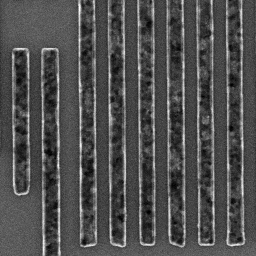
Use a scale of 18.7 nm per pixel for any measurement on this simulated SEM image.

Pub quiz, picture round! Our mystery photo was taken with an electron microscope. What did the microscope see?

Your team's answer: wiring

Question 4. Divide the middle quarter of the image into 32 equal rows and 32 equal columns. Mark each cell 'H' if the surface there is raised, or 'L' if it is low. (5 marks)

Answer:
LLLLHHHHLLLHHHHLLLLHHHLLLLHHHHLL
LLLLHHHHLLLHHHHLLLLHHHLLLLHHHHLL
LLLLHHHHLLLHHHHLLLLHHHLLLLHHHHLL
LLLLHHHHLLLHHHHLLLLHHHLLLLHHHHLL
LLLLHHHHLLLHHHHLLLLHHHLLLLHHHHLL
LLLLHHHHLLLHHHHLLLLHHHLLLLHHHHLL
LLLLHHHHLLLHHHHLLLLHHHLLLLHHHHLL
LLLLHHHHLLLHHHHLLLLHHHLLLLHHHHLL
LLLLHHHHLLLHHHHLLLLHHHLLLLHHHHLL
LLLLHHHHLLLHHHHLLLLHHHLLLLHHHHLL
LLLLHHHHLLLHHHHLLLLHHHLLLLHHHHLL
LLLLHHHHLLLHHHHLLLLHHHLLLLHHHHLL
LLLLHHHHLLLHHHHLLLLHHHLLLLHHHHLL
LLLLHHHHLLLHHHHLLLLHHHLLLLHHHHLL
LLLLHHHHLLLHHHHLLLLHHHLLLLHHHHLL
LLLLHHHHLLLHHHHLLLLHHHLLLLHHHHLL
LLLLHHHHLLLHHHHLLLLHHHLLLLHHHHLL
LLLLHHHHLLLHHHHLLLLHHHLLLLHHHHLL
LLLLHHHHLLLHHHHLLLLHHHLLLLHHHHLL
LLLLHHHHLLLHHHHLLLLHHHLLLLHHHHLL
LLLLHHHHLLLHHHHLLLLHHHLLLLHHHHLL
LLLLHHHHLLLHHHHLLLLHHHLLLLHHHHLL
LLLLHHHHLLLHHHHLLLLHHHLLLLHHHHLL
LLLLHHHHLLLHHHHLLLLHHHLLLLHHHHLL
LLLLHHHHLLLHHHHLLLLHHHLLLLHHHHLL
LLLLHHHHLLLHHHHLLLLHHHHLLLHHHHLL
LLLLHHHHLLLHHHHLLLLHHHHLLLHHHHLL
LLLLHHHHLLLHHHHLLLLHHHHLLLHHHHLL
LLLLHHHHLLLHHHHLLLLHHHHLLLHHHHLL
LLLLHHHHLLLHHHHLLLLHHHHLLLHHHHLL
LLLLHHHHLLLLHHHLLLLHHHHLLLHHHHLL
LLLLHHHHLLLLHHHLLLLHHHHLLLHHHHLL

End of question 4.